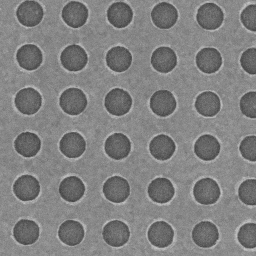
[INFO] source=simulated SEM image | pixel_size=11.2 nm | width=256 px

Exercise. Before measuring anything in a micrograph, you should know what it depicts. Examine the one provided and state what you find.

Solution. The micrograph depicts a regular array of holes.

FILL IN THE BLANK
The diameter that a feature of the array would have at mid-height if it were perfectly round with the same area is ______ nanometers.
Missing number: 307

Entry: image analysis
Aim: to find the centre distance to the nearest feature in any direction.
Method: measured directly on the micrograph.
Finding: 486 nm